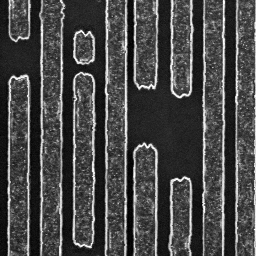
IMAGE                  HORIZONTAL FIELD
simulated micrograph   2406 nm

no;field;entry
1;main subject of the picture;parallel lines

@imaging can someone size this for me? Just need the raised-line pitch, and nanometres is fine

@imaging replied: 304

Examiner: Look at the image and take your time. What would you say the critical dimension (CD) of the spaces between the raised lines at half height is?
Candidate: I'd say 12.4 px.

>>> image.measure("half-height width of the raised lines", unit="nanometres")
189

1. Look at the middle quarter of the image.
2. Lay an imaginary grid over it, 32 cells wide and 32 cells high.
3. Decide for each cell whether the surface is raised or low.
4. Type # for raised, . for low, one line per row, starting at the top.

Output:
...........#####..#####....#####
...........#####..#####....#####
...###.....#####..#####....#####
...####....#####..#####....#####
..#####....#####..#####....#..##
..#####....#####..#####....#####
..#####...######...........#####
...####....#####............###.
...####....#####................
...####....#####................
...####....#####................
...####....#####................
...#####...#####................
...#####...#####................
..######...#####................
...#####...#####................
..######...#####................
...####....#####................
..#####....#####................
...####....#####................
...####....#####...###..........
...####....#####..#####.........
...####....####..######.........
..#####....#####.######.........
..#####....#####..#####.........
...####....#####.######.........
...####....#####.######.........
...#####...#####.######.........
...#####...#####.######.......#.
...#####...#####.######....#####
...####...######.######....#####
..#####...#####..######....#####